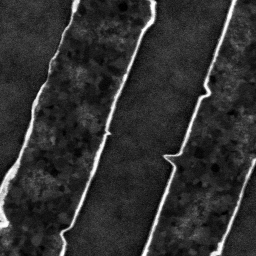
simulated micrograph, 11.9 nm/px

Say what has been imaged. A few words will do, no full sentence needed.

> one or a few lines or trenches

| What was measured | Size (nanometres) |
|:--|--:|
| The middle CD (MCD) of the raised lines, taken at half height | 882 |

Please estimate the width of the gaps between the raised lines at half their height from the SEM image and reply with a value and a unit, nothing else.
913 nm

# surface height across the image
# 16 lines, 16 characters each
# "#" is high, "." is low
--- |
.....#####....##
....#####.....##
....#####.....##
...#####.....###
...#####.....###
...#####.....###
..#####.....####
..#####.....####
..#####.....####
.#####.....#####
.#####.....#####
######.....####.
#####.....#####.
#####.....#####.
####......####..
####.....#####..